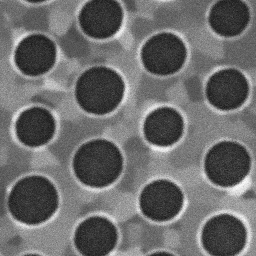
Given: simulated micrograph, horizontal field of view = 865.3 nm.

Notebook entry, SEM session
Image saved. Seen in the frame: a regular array of holes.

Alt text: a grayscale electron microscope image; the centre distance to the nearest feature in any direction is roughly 72.6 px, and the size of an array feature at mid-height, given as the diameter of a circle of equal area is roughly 0.155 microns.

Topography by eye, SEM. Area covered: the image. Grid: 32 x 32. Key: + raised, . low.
++++.+++++.....++++++++++++....+
++++++++++.....+++++++++++.....+
++++++++++.....+++++++++++.....+
++++++++++.....+++++++++++.....+
+++...+++++...+++++...+++++...++
++.....+++++++++++.....+++++++++
++.....+++++++++++.....+++++++++
++.....+++++++++++.....+++++++++
++.....++++...++++.....+++++.+++
+++..+++++.....+++++.+++++.....+
+++++++++.......++++++++++.....+
+++++++++.......++++++++++.....+
+++++++++......+++++++++++.....+
+++...++++.....++++...+++++...++
++.....+++++++++++.....+++++++++
++.....+++++++++++.....+++++++++
++.....+++++++++++.....+++++++++
++....+++++...++++.....+++++++++
++++.+++++.....+++++++++++.....+
+++++++++......+++++++++++.....+
+++++++++.......+++++++++......+
+++++++++......+++++++++++.....+
++....++++.....++++..+++++.....+
+......++++..+++++....++++++.+++
+......++++++++++......+++++++++
+......++++++++++......+++++++++
+......+++++++++++.....+++++++++
++....++++....+++++..+++++....++
+++++++++......++++++++++......+
+++++++++......++++++++++......+
+++++++++......++++++++++......+
++++++++++....+++++..+++++....++